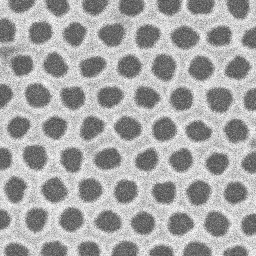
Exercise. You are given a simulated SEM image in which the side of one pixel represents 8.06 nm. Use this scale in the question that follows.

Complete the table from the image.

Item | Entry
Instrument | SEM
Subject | a regular array of holes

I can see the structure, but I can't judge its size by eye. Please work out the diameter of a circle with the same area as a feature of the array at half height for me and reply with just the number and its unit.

206 nm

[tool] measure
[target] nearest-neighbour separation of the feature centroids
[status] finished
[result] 278 nanometres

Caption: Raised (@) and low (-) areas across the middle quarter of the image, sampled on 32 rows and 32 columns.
-@@@-------@@-------@@------@@@-
-@@@------@@@------@@@------@@@-
-@@@-----@@@@@-----@@@------@@@-
@@@@@--@@@@@@@@--@@@@@@----@@@@@
@@@@@@@@@@@@@@@@@@@@@@@@@-@@@@@@
-@--@@@@@@@@-@@@@@---@@@@@@@@-@@
-----@@@@-----@@@@-----@@@@-----
-----@@@-------@@@------@@@-----
-----@@@-------@@-------@@------
-----@@@------@@@@------@@------
-----@@@@----@@@@@-----@@@@-----
@@-@@@@@@@@@@@@@@@@@@@@@@@@@---@
@@@@@@@@@@@@@@@@@@@@@@@@@@@@@@@@
@@@@@----@@@@@----@@@@@@---@@@@@
-@@@@-----@@@------@@@-----@@@@@
-@@@------@@--------@@------@@--
-@@@------@@--------@@------@@--
@@@@-----@@@@------@@@------@@--
@@@@----@@@@@@----@@@@-----@@@@-
@@@@@@@@@@@@@@@@@@@@@@@@-@@@@@@@
@@@@@@@@@@@@@@@@@@@@@@@@@@@@@@@@
----@@@@@-----@@@@@@---@@@@@----
-----@@@------@@@@------@@@-----
-----@@--------@@@------@@------
-----@@-------@@@@------@@------
----@@@@------@@@@-----@@@@-----
----@@@@@@-@@@@@@@@---@@@@@----@
@@-@@@@@@@@@@@@@@@@@@@@@@@@@@@@@
@@@@@---@@@@@@@@@@@@@@@@@@@@@@@@
@@@@-----@@@@-----@@@@@----@@@@@
-@@-------@@@-----@@@@------@@@-
-@@@------@@-------@@@------@@--